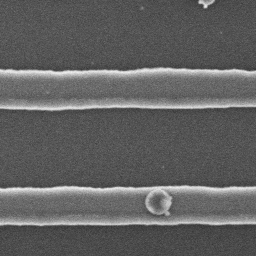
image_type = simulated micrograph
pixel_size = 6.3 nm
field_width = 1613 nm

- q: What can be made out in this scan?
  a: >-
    lines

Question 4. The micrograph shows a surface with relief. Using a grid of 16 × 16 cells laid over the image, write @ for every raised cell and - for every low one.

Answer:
----------------
----------------
----------------
----------------
@@@@@@@@@@@@@@@@
@@@@@@@@@@@@@@@@
@@@@@@@@@@@@@@@@
----------------
----------------
----------------
----------------
----------------
@@@@@@@@@@@@@@@@
@@@@@@@@@@@@@@@@
----------------
----------------